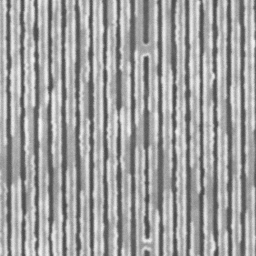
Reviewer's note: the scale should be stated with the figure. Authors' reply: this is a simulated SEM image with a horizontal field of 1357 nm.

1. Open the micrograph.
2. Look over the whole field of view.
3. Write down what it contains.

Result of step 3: parallel lines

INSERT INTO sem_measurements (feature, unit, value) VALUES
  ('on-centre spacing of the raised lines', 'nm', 73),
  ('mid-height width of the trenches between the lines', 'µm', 0.0239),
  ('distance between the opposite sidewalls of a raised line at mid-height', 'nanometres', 47.1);